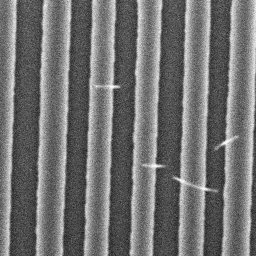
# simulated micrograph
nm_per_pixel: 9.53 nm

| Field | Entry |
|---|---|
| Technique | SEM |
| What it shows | lines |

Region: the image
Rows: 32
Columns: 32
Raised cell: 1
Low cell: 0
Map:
11000111100011000111000111000111
11000111100011000111000111000111
11000111100011000111000111000111
11000111100011000111000111000111
11000111100011000111000111000111
11000111100011000111000111000111
11000111100111000111000111000111
11000111100111000111000111000111
11000111100111000111000111000111
11000111000111000111000111000111
11000111000111000111000111000111
11000111000111000111000111000111
11000111000111000111000111001111
11000111000111000111000111001111
11000111000111000111000111001111
11000111000111000111000111001111
10000111000111000111000111001111
10000111000111000110000111001111
10000111000111000110000111001111
10000111000111000110000111001111
10000111000111000111000111001111
10000111000111000110000111001110
10000111000111000110000111001110
10000111000111000110000111001110
10000111000111000110000111001110
10000111000111000110000111001110
10000111000111000110000111001110
10000111000111000110000111001110
10000111000110000110001110001110
10000111000110001110001110001110
10000111000110001110001110001110
10000111000110001110001110001110